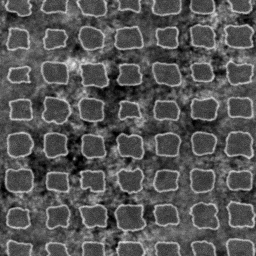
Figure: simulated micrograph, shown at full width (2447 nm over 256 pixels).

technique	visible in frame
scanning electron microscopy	a regular array of raised bodies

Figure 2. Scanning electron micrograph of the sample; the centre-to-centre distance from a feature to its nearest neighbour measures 334 nm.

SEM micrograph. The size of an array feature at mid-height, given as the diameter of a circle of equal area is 241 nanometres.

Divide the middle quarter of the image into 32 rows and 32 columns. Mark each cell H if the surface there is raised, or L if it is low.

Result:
HLLLHHHHHHLLLLHHHHHLLLHHHHHHLLLL
HLLLHHHHHHLLLLHHHHHLLLHHHHHHHLLL
HLLLHHHHHHHLLLHHHHHLLLHHHHHHHLLL
HLLLLHHHHHHLLHHHHHHLLLLHHHHHHLLL
HLLLLHHHHHHLLLHHHHHLLLLHHHHHHLLL
LLLLLHLLHHHLLLLLLLLLLLLLLLHHLLLL
LLLLLLLLLLLLLLLLLLLLLLLLLLLLLLLL
LLLLLLLLLLLLLLLLLLLLLLLLLLLLLLLL
LLLLLLLLLLLLLLLLLLLLLLLLLLLLLLLL
HLLLHHHHHHLLLLHHHLLLLLLHHHHHLLLL
HLLLHHHHHHLLLLHHHHHLLLLHHHHHLLLL
HHLLHHHHHHLLLLHHHHHLLLLHHHHHHLLL
HHLLHHHHHHLLLLHHHHHLLLLHHHHHHLLL
HLLLHHHHHHLLLLHHLLHLLLLHHHHHHLLL
LLLLLLLLLLLLLLLLLLLLLLLLLLLLLLLL
LLLLLLLLLLLLLLLLLLLLLLLLLLLLLLLL
LLLLLLLLLLLLLLLLLLLLLLLLLLLLLLLL
LLLLLLLLLLLLLLHLLLLLLLLLLHHHLLLL
HLLLLHHHHLLLLHHHHHHLLLLHHHHHHLLL
HLLLLHHHHHLLLHHHHHHHLLLHHHHHHLLL
LLLLLHHHHHLLLHHHHHHHLLLHHHHHHLLL
HLLLLHHHHHLLLLHHHHHHLLLHHHHHHLLL
HLLLLHHHHHLLLLHHHHHHLLLHHHHHLLLL
LLLLLLHLLLLLLLLLLLHLLLLLLLLLLLLL
LLLLLLLLLLLLLLLLLLLLLLLLLLLLLLLL
LLLLLLLLLLLLLLLLLLLLLLLLLLLLLLLL
LLLLLLLLLLLLLLHLLLHLLLLLLHLLLLLL
HLLLHHHHHHLLLHHHHHHHLLLHHHHHHLLL
HLLLHHHHHHLLLLHHHHHHLLLHHHHHHLLL
HLLLHHHHHHLLLLHHHHHLLLHHHHHHLLLL
HLLLHHHHHHLLLLHHHHHLLLLHHHHHLLLL
HLLLLLLHHHLLLLHHHHHLLLLHHHHHLLLL